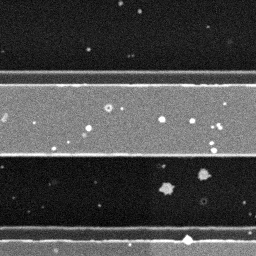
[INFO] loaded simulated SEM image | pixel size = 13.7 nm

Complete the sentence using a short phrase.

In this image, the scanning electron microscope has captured lines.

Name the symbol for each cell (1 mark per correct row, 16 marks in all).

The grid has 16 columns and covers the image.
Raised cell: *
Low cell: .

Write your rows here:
................
................
................
................
................
****************
****************
****************
****************
****************
................
................
................
................
****************
****************